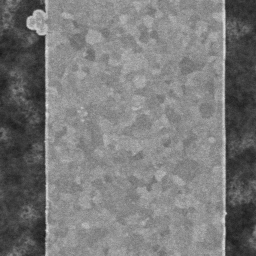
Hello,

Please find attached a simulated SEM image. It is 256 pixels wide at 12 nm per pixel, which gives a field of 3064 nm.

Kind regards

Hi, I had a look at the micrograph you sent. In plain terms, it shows one or a few lines or trenches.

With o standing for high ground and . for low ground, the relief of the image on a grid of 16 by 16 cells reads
...ooooooooooo..
..oooooooooooo..
...ooooooooooo..
...ooooooooooo..
...ooooooooooo..
...ooooooooooo..
...ooooooooooo..
...ooooooooooo..
...ooooooooooo..
...ooooooooooo..
...ooooooooooo..
...ooooooooooo..
...ooooooooooo..
...ooooooooooo..
...ooooooooooo..
...ooooooooooo..